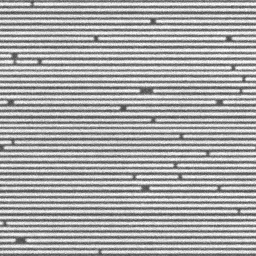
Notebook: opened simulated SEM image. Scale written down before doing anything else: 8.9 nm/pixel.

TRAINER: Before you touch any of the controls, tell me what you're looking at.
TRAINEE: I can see parallel lines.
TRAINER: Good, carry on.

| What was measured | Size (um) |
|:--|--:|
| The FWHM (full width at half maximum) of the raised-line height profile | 0.0234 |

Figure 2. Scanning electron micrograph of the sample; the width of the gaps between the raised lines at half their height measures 23.4 nm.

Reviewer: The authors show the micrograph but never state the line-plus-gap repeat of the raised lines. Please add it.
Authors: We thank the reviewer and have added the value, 51.3 nm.